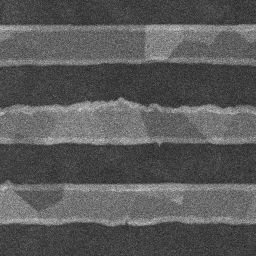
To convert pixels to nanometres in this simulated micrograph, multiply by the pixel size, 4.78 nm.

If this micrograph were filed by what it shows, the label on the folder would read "one or a few lines or trenches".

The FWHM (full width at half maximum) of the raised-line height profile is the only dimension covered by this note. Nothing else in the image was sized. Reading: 163 nanometers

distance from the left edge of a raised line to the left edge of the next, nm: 381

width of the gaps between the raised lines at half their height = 222 nm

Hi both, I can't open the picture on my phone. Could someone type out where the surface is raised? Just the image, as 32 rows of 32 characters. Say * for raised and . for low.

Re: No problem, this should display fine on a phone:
................................
................................
................................
**********..*...**********....**
********************************
********************************
********************************
*********************.**********
................................
................................
................................
................................
................................
.........*********.*.....*......
********************************
********************************
********************************
********.***********************
................................
................................
................................
................................
................................
********************************
********************************
********************************
********************************
*********..*********...*.*******
................................
................................
................................
................................